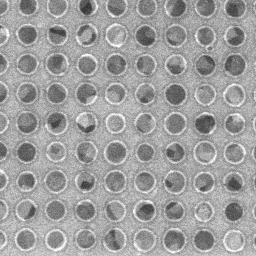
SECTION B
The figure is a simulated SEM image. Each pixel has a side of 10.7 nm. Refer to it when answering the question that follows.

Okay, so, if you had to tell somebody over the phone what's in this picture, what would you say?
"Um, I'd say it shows a regular array of raised bodies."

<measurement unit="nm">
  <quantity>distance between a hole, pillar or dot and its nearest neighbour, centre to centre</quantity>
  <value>310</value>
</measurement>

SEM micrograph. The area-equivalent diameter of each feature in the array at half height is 222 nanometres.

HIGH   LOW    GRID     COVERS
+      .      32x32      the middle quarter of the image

+...++++..++++++..+++++...++++..
+...++++...++++...+++++...++++..
.....++.....++.....+++.....++...
................................
................................
....+++....++++....+++....++++..
+..+++++...++++...+++++..+++++..
+..+++++..+++++...+++++..++++++.
...+++++..+++++...+++++..+++++..
....+++....+++.....+++....++++..
................................
................................
....+++.............+......++...
+..+++++...++++...++++....++++..
+..+++++...++++...+++++..+++++..
+..+++++...++++...+++++..+++++..
....++++...++++...++++....++++..
...........................+....
................................
.....+......++..................
...+++++...++++....+++....+++...
...+++++..++++++..++++...+++++..
...+++++..++++++..+++++..+++++..
...+++++...++++...++++....++++..
....+++.....+++............++...
................................
................................
....+++....++++...++++....++++..
+..+++++..+++++...+++++..+++++..
+..+++++..+++++...+++++..+++++..
...+++++..+++++...++++...+++++..
....+++....++++....+++....++++..